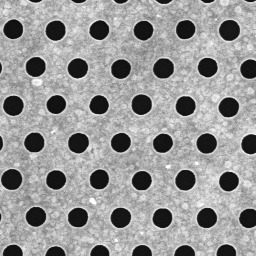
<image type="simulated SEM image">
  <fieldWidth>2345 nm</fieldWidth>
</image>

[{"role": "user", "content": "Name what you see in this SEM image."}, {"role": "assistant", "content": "a regular array of holes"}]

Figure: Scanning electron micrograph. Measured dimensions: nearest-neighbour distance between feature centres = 386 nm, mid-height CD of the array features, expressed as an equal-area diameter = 186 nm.